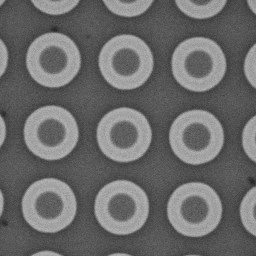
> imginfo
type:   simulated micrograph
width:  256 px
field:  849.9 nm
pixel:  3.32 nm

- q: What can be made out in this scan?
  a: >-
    an array of small figures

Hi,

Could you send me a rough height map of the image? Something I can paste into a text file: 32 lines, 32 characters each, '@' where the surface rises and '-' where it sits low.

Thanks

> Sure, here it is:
----@@@@@@---@@@@@@---@@@@@@---@
-----@@@------@@@@-----@@@@-----
--------------------------------
--------------------------------
-----@@@-------@@---------------
----@@@@@----@@@@@-----@@@@-----
@--@@@@@@@---@@@@@@---@@@@@@---@
@--@@@@@@@--@@@@@@@--@@@@@@@---@
@--@@@@@@@--@@@@@@@---@@@@@@---@
----@@@@@----@@@@@@---@@@@@@---@
-----@@@------@@@@-----@@@@----@
--------------------------------
--------------------------------
-----@@@-------@----------------
----@@@@@----@@@@@----@@@@@-----
@--@@@@@@@--@@@@@@@---@@@@@@---@
@--@@@@@@@--@@@@@@@--@@@@@@@--@@
---@@@@@@@--@@@@@@@--@@@@@@@--@@
----@@@@@----@@@@@---@@@@@@@--@@
-----@@@-----@@@@@----@@@@@----@
------------------------@-------
--------------------------------
-----@@-------------------------
----@@@@@----@@@@@----@@@@------
---@@@@@@---@@@@@@---@@@@@@----@
---@@@@@@@--@@@@@@@--@@@@@@@--@@
---@@@@@@---@@@@@@@--@@@@@@@--@@
---@@@@@@---@@@@@@---@@@@@@---@@
----@@@@-----@@@@-----@@@@@----@
-----------------------@@-------
--------------------------------
-----@@-------------------------